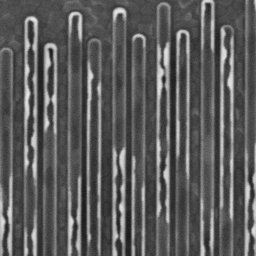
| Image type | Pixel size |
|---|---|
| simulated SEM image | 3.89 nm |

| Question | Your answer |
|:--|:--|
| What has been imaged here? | parallel lines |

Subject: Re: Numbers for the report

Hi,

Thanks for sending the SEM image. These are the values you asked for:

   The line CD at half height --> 49.6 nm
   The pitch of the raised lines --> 84.6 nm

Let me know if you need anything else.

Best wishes